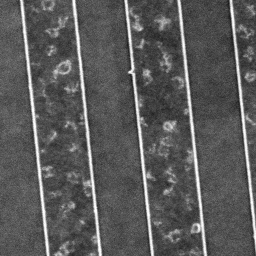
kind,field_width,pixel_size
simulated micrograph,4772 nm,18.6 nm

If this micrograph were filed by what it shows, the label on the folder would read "one or a few lines or trenches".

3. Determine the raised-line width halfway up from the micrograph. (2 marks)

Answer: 0.974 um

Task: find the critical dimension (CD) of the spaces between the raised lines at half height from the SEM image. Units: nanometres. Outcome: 974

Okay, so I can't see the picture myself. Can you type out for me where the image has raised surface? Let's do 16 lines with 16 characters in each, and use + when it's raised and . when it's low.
.++++...+++....+
.++++...+++....+
..+++...+++....+
..+++...++++...+
..+++...++++...+
..+++...++++...+
..+++....+++...+
..+++....+++...+
..++++...+++...+
..++++...+++...+
..++++...+++....
...+++...+++....
...+++...+++....
...+++...++++...
...+++...++++...
...+++....+++...